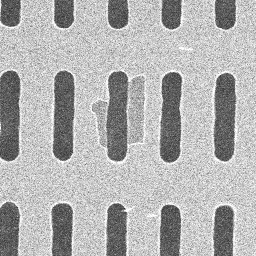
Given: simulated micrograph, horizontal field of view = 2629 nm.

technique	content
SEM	holes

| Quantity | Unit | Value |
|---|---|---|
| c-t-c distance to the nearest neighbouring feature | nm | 551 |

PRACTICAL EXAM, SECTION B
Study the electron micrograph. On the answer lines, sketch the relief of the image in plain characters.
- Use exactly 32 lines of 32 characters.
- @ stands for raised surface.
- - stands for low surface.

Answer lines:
---@@@@--@@@@---@@@@---@@@@---@@
---@@@@--@@@@---@@@@---@@@@---@@
---@@@@--@@@@---@@@@---@@@@---@@
@@@@@@@@@@@@@@-@@@@@@-@@@@@--@@@
@@@@@@@@@@@@@@@@@@@@@@@@@@@@@@@@
@@@@@@@@@@@@@@@@@@@@@@@@@@@@@@@@
@@@@@@@@@@@@@@@@@@@@@@@@@@@@@@@@
@@@@@@@@@@@@@@@@@@@@@@@@@@@@@@@@
@@@@@@@@@@@@@@@@@@@@@@@@@@@@@@@@
--@@@@@--@@@@@--@@@@@--@@@@--@@@
---@@@@--@@@@---@@@@---@@@@--@@@
---@@@@--@@@@@--@@@@---@@@@--@@@
--@@@@@--@@@@@--@@@@---@@@@---@@
--@@@@@--@@@@---@@@@---@@@@---@@
---@@@@--@@@@---@@@@---@@@@--@@@
---@@@@--@@@@---@@@@---@@@@--@@@
--@@@@@--@@@@---@@@@---@@@@--@@@
--@@@@@--@@@@---@@@@---@@@@--@@@
---@@@---@@@@---@@@@---@@@@--@@@
--@@@@@--@@@@---@@@@--@@@@@--@@@
@@@@@@@@@@@@@@@@@@@@@@@@@@@@@@@@
@@@@@@@@@@@@@@@@@@@@@@@@@@@@@@@@
@@@@@@@@@@@@@@@@@@@@@@@@@@@@@@@@
@@@@@@@@@@@@@@@@@@@@@@@@@@@@@@@@
@@@@@@@@@@@@@@@@@@@@@@@@@@@@@@@@
@-@@@@@-@@@@@@-@@@@@@@@@@@@@@@@@
--@@@@---@@@@@--@@@@---@@@@--@@@
--@@@@---@@@@---@@@@---@@@@--@@@
--@@@@@--@@@@---@@@@---@@@@--@@@
--@@@@@--@@@@---@@@@---@@@@--@@@
--@@@@---@@@@---@@@@---@@@@--@@@
--@@@@---@@@@---@@@@---@@@@--@@@